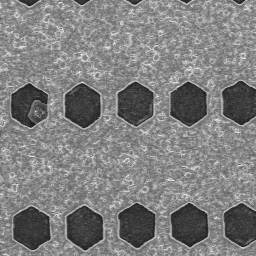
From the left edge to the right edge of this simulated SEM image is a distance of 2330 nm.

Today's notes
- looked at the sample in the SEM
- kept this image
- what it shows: a regular array of holes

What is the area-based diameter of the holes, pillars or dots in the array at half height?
364 nanometers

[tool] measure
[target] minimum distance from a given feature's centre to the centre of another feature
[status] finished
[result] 480 nm